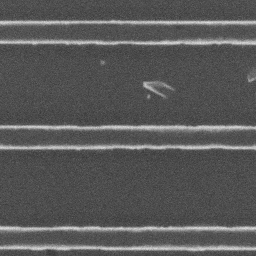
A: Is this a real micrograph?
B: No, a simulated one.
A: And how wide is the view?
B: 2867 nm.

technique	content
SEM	lines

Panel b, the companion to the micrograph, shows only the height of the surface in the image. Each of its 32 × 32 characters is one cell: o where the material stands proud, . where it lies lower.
................................
................................
................................
oooooooooooooooooooooooooooooooo
oooooooooooooooooooooooooooooooo
................................
................................
................................
................................
................................
................................
................................
................................
................................
................................
................................
oooooooooooooooooooooooooooooooo
oooooooooooooooooooooooooooooooo
oooooooooooo.......oo..oo...oooo
................................
................................
................................
................................
................................
................................
................................
................................
................................
................................
oooooooooooooooooooooooooooooooo
oooooooooooooooooooooooooooooooo
................................